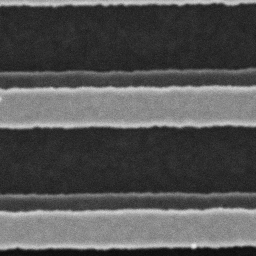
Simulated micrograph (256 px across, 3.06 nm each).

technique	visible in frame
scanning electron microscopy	lines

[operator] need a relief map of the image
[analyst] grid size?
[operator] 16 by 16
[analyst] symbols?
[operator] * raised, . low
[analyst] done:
................
................
................
................
....**.*********
****************
****************
****************
................
................
................
................
****************
****************
****************
**********......